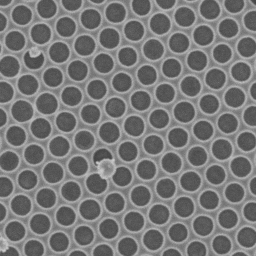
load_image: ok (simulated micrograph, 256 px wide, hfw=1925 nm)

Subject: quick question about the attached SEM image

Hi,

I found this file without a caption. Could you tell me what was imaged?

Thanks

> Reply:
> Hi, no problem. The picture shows a regular array of holes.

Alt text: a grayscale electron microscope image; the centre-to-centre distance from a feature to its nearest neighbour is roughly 193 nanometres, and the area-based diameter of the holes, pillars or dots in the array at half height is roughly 153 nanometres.